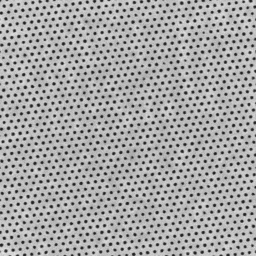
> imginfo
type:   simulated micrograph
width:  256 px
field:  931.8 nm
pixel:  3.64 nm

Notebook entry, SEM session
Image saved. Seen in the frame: a regular array of holes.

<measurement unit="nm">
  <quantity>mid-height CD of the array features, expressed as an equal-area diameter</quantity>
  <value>10.9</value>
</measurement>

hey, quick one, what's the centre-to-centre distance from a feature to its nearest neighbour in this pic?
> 0.025 um